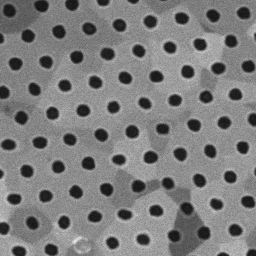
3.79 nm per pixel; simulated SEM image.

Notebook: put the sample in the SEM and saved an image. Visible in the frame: a regular array of holes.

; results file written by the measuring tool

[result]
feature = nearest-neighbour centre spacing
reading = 30.1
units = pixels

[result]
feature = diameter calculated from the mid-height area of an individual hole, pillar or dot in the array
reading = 14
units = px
